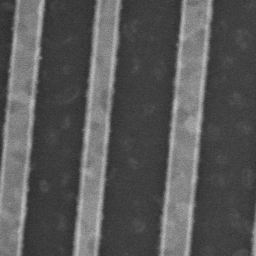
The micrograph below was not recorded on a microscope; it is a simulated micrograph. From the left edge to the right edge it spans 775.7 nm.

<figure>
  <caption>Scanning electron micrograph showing one or a few lines or trenches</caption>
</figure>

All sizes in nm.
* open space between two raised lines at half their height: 200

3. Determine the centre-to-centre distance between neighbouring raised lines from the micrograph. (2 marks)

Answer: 255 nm